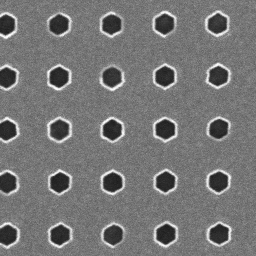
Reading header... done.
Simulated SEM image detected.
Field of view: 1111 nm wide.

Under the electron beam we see a regular array of holes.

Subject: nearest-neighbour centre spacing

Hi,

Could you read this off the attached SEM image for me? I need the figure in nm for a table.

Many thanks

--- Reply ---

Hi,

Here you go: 228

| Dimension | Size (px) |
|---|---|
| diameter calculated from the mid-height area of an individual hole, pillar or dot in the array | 20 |